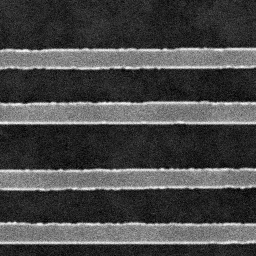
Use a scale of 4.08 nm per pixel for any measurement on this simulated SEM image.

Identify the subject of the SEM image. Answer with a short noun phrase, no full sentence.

lines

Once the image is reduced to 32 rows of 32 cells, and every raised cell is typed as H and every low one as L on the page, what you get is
LLLLLLLLLLLLLLLLLLLLLLLLLLLLLLLL
LLLLLLLLLLLLLLLLLLLLLLLLLLLLLLLL
LLLLLLLLLLLLLLLLLLLLLLLLLLLLLLLL
LLLLLLLLLLLLLLLLLLLLLLLLLLLLLLLL
LLLLLLLLLLLLLLLLLLLLLLLLLLLLLLLL
LLLLLLLLLLLLLLLLLLLLLLLLLLLLLLLL
HHHHHHHHHHHHHHHHHHHHHHHHHHHHHHHH
HHHHHHHHHHHHHHHHHHHHHHHHHHHHHHHH
HLHHLHHHHHHHHHLHHHLHLLLLLLLHLLLL
LLLLLLLLLLLLLLLLLLLLLLLLLLLLLLLL
LLLLLLLLLLLLLLLLLLLLLLLLLLLLLLLL
LLLLLLLLLLLLLLLLLLLLLLLLLLLLLLLL
LLLLLLLLLLLLLLLLLLLLLLLLLLLLLLLL
HHHHHHHHHHHHHHHHHHHHHHHHHHHHHHHH
HHHHHHHHHHHHHHHHHHHHHHHHHHHHHHHH
LLLLLLLLLLLLLLLLLLLLLLLLLLLLLLLL
LLLLLLLLLLLLLLLLLLLLLLLLLLLLLLLL
LLLLLLLLLLLLLLLLLLLLLLLLLLLLLLLL
LLLLLLLLLLLLLLLLLLLLLLLLLLLLLLLL
LLLLLLLLLLLLLLLLLLLLLLLLLLLLLLLL
LLLLLLLLLLLLLLLLLLLLLLLLLLLLLLLL
HHHHHHHHHHHHHHHHHHHHHHHHHHHHHHHH
HHHHHHHHHHHHHHHHHHHHHHHHHHHHHHHH
HHHHHHHHHHHHHHHHHHHHHLLHHLLLLLHL
LLLLLLLLLLLLLLLLLLLLLLLLLLLLLLLL
LLLLLLLLLLLLLLLLLLLLLLLLLLLLLLLL
LLLLLLLLLLLLLLLLLLLLLLLLLLLLLLLL
LLLLLLLLLLLLLLLLLLLLLLLLLLLLLLLL
HHHHHHHHHHHHHHHHHHHHHHHHHHHHHHHH
HHHHHHHHHHHHHHHHHHHHHHHHHHHHHHHH
LLLLLLLLLLLLLLLLLLLLLLLLLLLLLLLL
LLLLLLLLLLLLLLLLLLLLLLLLLLLLLLLL